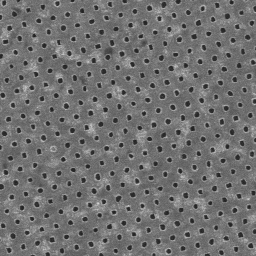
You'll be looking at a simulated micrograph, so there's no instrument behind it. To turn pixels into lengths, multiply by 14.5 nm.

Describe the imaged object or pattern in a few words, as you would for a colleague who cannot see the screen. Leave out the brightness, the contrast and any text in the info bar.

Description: a regular array of holes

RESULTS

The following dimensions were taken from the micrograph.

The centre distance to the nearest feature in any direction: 14.3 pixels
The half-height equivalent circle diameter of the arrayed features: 0.0749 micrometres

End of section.